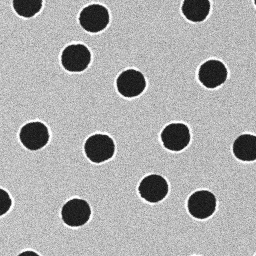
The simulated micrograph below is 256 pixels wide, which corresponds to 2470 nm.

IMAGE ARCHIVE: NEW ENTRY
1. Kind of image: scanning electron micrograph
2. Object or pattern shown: a regular array of holes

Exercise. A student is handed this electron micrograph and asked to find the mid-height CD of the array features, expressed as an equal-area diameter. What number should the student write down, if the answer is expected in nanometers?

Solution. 281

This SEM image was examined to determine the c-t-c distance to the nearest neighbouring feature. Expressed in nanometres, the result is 563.